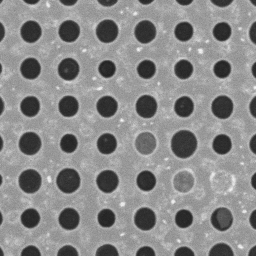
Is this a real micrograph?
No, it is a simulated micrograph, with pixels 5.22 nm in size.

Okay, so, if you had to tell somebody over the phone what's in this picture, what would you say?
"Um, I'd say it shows a regular array of holes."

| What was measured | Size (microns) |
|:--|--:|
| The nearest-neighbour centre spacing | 0.194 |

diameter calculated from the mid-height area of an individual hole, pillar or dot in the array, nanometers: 110